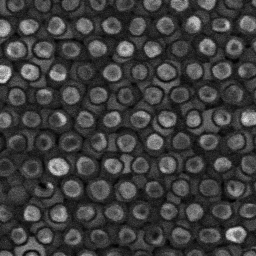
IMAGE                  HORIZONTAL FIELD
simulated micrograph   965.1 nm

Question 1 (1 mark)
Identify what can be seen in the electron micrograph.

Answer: a regular array of raised bodies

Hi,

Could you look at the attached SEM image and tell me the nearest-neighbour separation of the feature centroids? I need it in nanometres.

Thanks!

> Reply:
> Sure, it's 97.9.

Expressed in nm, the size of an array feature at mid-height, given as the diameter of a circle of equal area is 60.3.